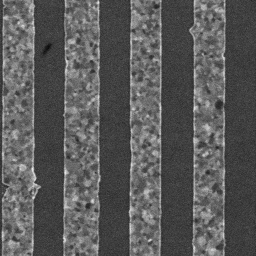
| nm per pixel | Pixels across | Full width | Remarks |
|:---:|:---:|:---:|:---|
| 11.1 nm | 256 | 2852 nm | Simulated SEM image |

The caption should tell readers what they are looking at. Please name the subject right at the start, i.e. one or a few lines or trenches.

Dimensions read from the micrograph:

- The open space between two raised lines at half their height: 32.4 px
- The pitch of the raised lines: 0.709 microns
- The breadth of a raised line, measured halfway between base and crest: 334 nanometres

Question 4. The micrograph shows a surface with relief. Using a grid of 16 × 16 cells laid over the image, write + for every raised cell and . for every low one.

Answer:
++..++..++..++..
++..++..++..++..
++..++..++..++..
++..++..++..++..
++..++..++..++..
++..++..++..++..
++..++..++..++..
++..++..++..++..
++..++..++..++..
++..++..++..++..
++..++..++..++..
++..++..++..++..
++..++..++..++..
++..++..++..++..
++..++..++..++..
++..++..++..++..